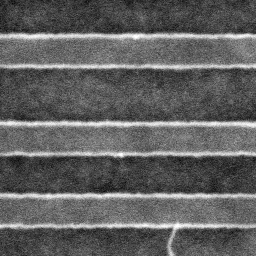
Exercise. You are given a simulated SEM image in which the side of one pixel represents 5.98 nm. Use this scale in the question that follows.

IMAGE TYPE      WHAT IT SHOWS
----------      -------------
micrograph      lines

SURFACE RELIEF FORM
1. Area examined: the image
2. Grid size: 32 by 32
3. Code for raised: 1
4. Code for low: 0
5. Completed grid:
00000000000000000000000000000000
00000000000000000000000000000000
00000000000000000000000000000000
00000000000000000000000000000000
11111111111111111111111111111111
11111111111111111111111111111111
11111111111111111111111111111111
11111111111111111111111111111111
00000000000000000000000000000000
00000000000000000000000000000000
00000000000000000000000000000000
00000000000000000000000000000000
00000000000000000000000000000000
00000000000000000000000000000000
00000000000000000000000000000000
11111111111111111111111111111111
11111111111111111111111111111111
11111111111111111111111111111111
11111111111111111111111111111111
00000000000000000000000000000000
00000000000000000000000000000000
00000000000000000000000000000000
00000000000000000000000000000000
00000000000000000000000000000000
11111111111111111111111111111111
11111111111111111111111111111111
11111111111111111111111111111111
11111111111111111111111111111111
00000000000000000000000000000000
00000000000000000000000000000000
00000000000000000000000000000000
00000000000000000000000000000000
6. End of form